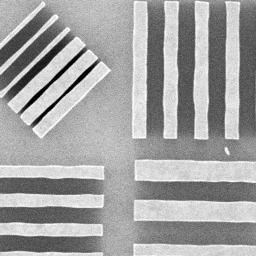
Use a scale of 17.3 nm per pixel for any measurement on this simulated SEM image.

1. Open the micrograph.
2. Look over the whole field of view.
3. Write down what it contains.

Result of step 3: groups of lines, slits or small figures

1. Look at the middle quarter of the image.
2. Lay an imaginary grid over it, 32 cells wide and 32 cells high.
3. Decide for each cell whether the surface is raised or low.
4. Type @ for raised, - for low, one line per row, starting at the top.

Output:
--@@@@--@@--------@@@----@@@----
-@@@@--@@@@-------@@@----@@@----
@@@@--@@@@@-------@@@----@@@----
@@@--@@@@@--------@@@----@@@----
@@--@@@@----------@@@----@@@----
@--@@@@----------@@@@----@@@----
@-@@@@-----------@@@@----@@@----
-@@@@------------@@@@----@@@----
@@@@@------------@@@@----@@@----
@@@@-------------@@@@----@@@----
@@---------------@@@@----@@@----
@----------------@@@@----@@@----
-----------------@@@@----@@@----
-----------------@@@@----@@@----
-----------------@@@-----@@@----
-----------------@@@-----@@@----
-----------------@@@-----@@@----
-----------------@@@-----@@@----
--------------------------------
--------------------------------
--------------------------------
--------------------------------
--------------------------------
--------------------------------
------------------@@@@@@@@@@@@@@
------------------@@@@@@@@@@@@@@
@@@@@@@@@@--------@@@@@@@@@@@@@@
@@@@@@@@@@--------@@@@@@@@@@@@@@
----@@@@@@--------@@@@@@@@@@@@@@
--------------------------------
--------------------------------
--------------------------------